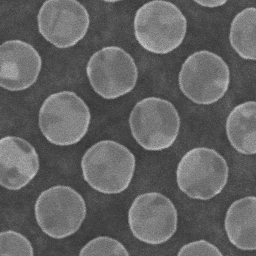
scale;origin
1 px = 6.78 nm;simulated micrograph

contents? a regular array of raised bodies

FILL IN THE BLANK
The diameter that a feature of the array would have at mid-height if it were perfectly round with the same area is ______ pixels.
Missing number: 50.8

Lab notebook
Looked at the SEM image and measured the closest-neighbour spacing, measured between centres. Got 448 nanometers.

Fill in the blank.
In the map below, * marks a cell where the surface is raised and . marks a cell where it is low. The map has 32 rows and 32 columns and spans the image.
......****........***....***....
.....******......******.......**
.....******......******......***
.....******......******......***
.....*****.......******......***
***....**.........****.......***
*****.......****...**....*....**
*****......******......*****....
*****......******......*****....
*****......******.....*******...
****.......******.....*******...
............****.......*****....
......****........**....***.....
.....******......*****........**
.....******.....******.......***
.....******.....******......****
.....******......*****......****
***...****.......*****.......***
****.......*****..**.........***
*****......******......*****....
*****.....*******.....******....
*****.....*******.....******....
****.......*****......******....
.*.....**...****.......*****....
.....*****........**....***.....
....*******......****........***
....*******.....******......****
.....*****......******......****
.....*****......******......****
***...**.........****........***
****.......****.........**...***
****......******......*****.....